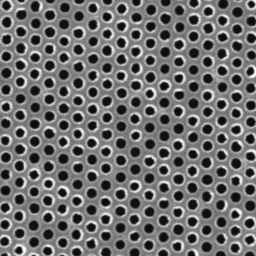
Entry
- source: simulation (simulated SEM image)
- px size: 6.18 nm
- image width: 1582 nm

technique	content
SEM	a regular array of holes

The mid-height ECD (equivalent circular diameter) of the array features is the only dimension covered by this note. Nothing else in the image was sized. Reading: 61.5 nm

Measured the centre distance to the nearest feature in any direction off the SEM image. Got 0.0999 microns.